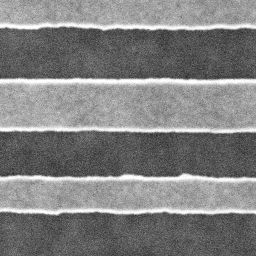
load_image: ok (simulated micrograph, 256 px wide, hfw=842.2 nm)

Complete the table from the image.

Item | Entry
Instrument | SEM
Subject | lines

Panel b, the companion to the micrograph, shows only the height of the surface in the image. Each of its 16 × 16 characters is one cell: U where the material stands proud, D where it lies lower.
UUUUUUUUUUUUUUUU
UUUUUUUUUUUUUUUU
DDDDDDDDDDDDDDDD
DDDDDDDDDDDDDDDD
DDDDDDDDDDDDDDDD
UUUUUUUUUUUUUUUU
UUUUUUUUUUUUUUUU
UUUUUUUUUUUUUUUU
DDDDDDDDDDDDDDDD
DDDDDDDDDDDDDDDD
DDDDDDDDDDDDDDDD
UUUUUUUUUUUUUUUU
UUUUUUUUUUUUUUUU
DDDDDDDDDDDDDDDD
DDDDDDDDDDDDDDDD
DDDDDDDDDDDDDDDD